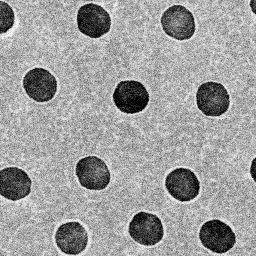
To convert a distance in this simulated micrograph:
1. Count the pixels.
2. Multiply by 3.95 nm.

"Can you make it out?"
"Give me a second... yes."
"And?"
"a regular array of holes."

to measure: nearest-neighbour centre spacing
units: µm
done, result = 0.324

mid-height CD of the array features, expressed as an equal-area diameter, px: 35.5